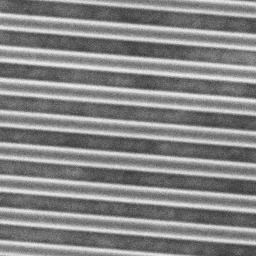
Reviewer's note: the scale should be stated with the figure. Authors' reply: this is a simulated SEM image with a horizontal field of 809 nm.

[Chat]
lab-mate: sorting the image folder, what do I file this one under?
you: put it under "parallel lines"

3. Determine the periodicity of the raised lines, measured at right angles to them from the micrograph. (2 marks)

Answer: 32.3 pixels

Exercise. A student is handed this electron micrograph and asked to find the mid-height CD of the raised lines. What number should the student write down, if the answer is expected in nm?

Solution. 44.1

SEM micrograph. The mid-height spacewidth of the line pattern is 55.9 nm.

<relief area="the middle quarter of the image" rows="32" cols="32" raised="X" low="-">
XXXXXXXXXXXXXXXXXXXXXXXXXXXXXXXX
------------XXXXXXXXXXXXXXXXXXXX
------------------------XXXXXXXX
--------------------------------
--------------------------------
XXXXX---------------------------
XXXXXXXXXXXXXXXXX---------------
XXXXXXXXXXXXXXXXXXXXXXXXXXXXX---
XXXXXXXXXXXXXXXXXXXXXXXXXXXXXXXX
----------XXXXXXXXXXXXXXXXXXXXXX
-------------------------XXXXXXX
--------------------------------
--------------------------------
XXX-----------------------------
XXXXXXXXXXXXXXX-----------------
XXXXXXXXXXXXXXXXXXXXXXXXXXX-----
XXXXXXXXXXXXXXXXXXXXXXXXXXXXXXXX
-----------XXXXXXXXXXXXXXXXXXXXX
-----------------------XXXXXXXXX
--------------------------------
--------------------------------
XXX-----------------------------
XXXXXXXXXXXXXXX-----------------
XXXXXXXXXXXXXXXXXXXXXXXXXXX-----
XXXXXXXXXXXXXXXXXXXXXXXXXXXXXXXX
---------XXXXXXXXXXXXXXXXXXXXXXX
---------------------XXXXXXXXXXX
--------------------------------
--------------------------------
X-------------------------------
XXXXXXXXXXXXX-------------------
XXXXXXXXXXXXXXXXXXXXXXXXX-------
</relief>